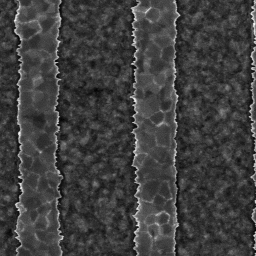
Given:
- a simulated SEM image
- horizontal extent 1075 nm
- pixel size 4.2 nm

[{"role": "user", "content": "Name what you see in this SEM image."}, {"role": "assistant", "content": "one or a few lines or trenches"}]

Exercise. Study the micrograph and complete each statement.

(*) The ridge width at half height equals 168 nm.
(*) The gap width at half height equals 319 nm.